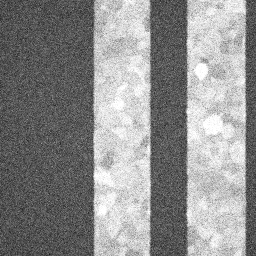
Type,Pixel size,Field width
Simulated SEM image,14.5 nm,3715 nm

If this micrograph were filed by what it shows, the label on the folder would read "one or a few lines or trenches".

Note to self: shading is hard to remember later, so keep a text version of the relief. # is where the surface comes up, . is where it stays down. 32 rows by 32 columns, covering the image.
............#######.....#######.
............#######.....#######.
............#######.....#######.
............#######.....#######.
............#######.....#######.
............#######....########.
............#######.....#######.
............#######.....#######.
............#######.....#######.
............#######....########.
............#######.....#######.
............#######.....#######.
............#######.....#######.
............#######....########.
............#######....########.
............#######.....#######.
............#######.....#######.
............#######....########.
............#######....########.
............#######.....#######.
............#######.....#######.
............#######....########.
............#######.....#######.
............#######.....#######.
............#######.....#######.
............#######....########.
............#######....########.
............#######....########.
............#######.....#######.
............#######....########.
............#######.....#######.
............#######.....#######.